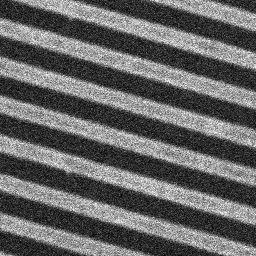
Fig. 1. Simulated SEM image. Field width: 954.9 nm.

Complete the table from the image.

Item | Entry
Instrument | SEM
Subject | parallel lines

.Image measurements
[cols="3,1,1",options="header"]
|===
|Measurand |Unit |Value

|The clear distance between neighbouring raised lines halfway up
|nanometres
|82.4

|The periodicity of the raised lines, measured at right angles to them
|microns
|0.139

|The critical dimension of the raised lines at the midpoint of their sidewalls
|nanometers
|56.4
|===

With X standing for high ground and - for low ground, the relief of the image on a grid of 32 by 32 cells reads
----XXXXXX-----------XXXXXX-----
-------XXXXXXX----------XXXXXXX-
X----------XXXXXX----------XXXXX
XXXX----------XXXXXXX----------X
-XXXXXXX----------XXXXXX--------
----XXXXXXX----------XXXXXXX----
--------XXXXXXX---------XXXXXXX-
X----------XXXXXXX----------XXXX
XXXXX---------XXXXXXX-----------
-XXXXXXX----------XXXXXXX-------
----XXXXXXX----------XXXXXXX----
--------XXXXXXX----------XXXXXXX
XX---------XXXXXXX----------XXXX
XXXXX----------XXXXXXX----------
--XXXXXXX---------XXXXXXX-------
-----XXXXXXX----------XXXXXXX---
--------XXXXXXX----------XXXXXXX
XX----------XXXXXXX----------XXX
XXXXXX---------XXXXXXX----------
--XXXXXXX----------XXXXXXX------
------XXXXXX----------XXXXXXX---
---------XXXXXXX----------XXXXXX
XX-----------XXXXXX----------XXX
XXXXXX----------XXXXXXX---------
---XXXXXX----------XXXXXXX------
------XXXXXXX----------XXXXXXX--
----------XXXXXX----------XXXXXX
XXX----------XXXXXXX----------XX
XXXXXX-----------XXXXXX---------
---XXXXXXX----------XXXXXXX-----
------XXXXXXX----------XXXXXXX--
----------XXXXXXX----------XXXXX